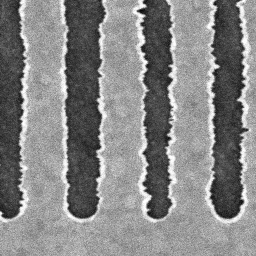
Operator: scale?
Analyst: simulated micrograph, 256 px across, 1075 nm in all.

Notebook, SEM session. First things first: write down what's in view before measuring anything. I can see one or a few lines or trenches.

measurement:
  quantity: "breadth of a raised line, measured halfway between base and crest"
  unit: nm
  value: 176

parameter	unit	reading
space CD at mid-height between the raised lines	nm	128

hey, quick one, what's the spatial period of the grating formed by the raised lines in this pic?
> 310 nanometers